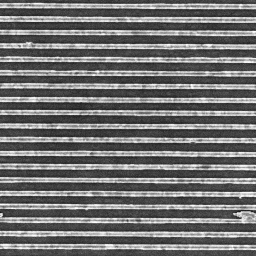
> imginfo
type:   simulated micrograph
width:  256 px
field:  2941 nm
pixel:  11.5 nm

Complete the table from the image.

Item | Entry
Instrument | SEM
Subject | parallel lines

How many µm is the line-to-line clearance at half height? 0.112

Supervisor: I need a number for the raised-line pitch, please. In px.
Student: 13.4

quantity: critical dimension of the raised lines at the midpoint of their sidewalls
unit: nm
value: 44.5